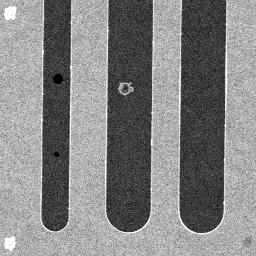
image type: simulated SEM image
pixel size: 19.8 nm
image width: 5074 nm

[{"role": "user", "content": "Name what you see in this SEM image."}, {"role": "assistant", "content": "groups of lines, slits or small figures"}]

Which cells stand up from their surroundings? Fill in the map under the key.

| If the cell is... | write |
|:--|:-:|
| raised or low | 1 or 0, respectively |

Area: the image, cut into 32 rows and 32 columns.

11111000011110000001111000001111
11111000011110000001111000001111
11111000011110000001111000001111
11111000011110000001111000001111
11111000011110000001111000001111
11111000011110000001111000001111
11111000011110000001111000001111
11111000011110000001110000001111
11111000011110000001110000001111
11111000011110000001110000001111
11111000011110010001110000001111
11111000011110010001110000001111
11111000011110000001110000001111
11111000011110000001110000001111
11111000011110000001110000001111
11111000011110000001110000001111
11111000011110000001110000001111
11111000011110000001110000001111
11111000011110000001110000001111
11111000011110000001110000001111
11111000011110000001110000001111
11111000011110000001110000001111
11111000011110000001110000001111
11111000011110000001110000001111
11111000011110000001110000001111
11111000011110000001110000001111
11111000011110000001110000001111
11111000011111000001111000001111
11111100111111000011111000011111
11111111111111111111111111111111
11111111111111111111111111111111
11111111111111111111111111111111